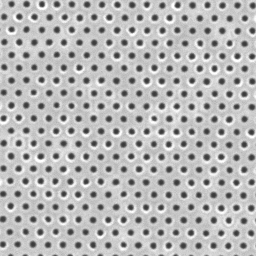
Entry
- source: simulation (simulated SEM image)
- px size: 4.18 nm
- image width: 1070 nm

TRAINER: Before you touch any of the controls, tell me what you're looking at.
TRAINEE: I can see a regular array of holes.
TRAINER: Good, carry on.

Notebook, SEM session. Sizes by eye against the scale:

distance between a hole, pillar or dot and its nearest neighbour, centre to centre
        60.1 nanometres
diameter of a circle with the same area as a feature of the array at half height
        26.7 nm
